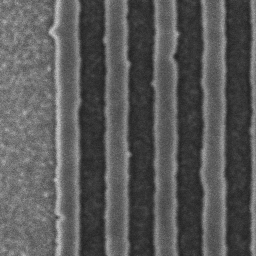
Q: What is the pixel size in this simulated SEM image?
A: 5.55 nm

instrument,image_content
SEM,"parallel lines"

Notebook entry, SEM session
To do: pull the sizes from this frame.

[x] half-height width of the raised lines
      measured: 124 nanometres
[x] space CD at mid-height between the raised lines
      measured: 25.9 px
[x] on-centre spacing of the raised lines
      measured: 48.7 px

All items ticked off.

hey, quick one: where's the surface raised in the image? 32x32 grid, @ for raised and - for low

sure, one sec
-------@@@---@@@---@@@---@@@---@
-------@@@---@@@---@@@---@@@---@
-------@@@---@@@---@@@---@@@---@
-------@@@---@@@---@@@---@@@----
-------@@@---@@@---@@@---@@@----
-------@@@---@@@---@@@---@@@---@
-------@@@---@@@---@@@---@@@---@
-------@@@---@@@---@@@---@@@---@
-------@@@---@@@---@@@---@@@---@
-------@@@---@@@---@@@---@@@---@
-------@@@---@@@---@@@---@@@---@
-------@@@---@@@---@@@---@@@---@
-------@@@---@@@---@@@---@@@----
-------@@@---@@@---@@@---@@@---@
-------@@@---@@@---@@@---@@@---@
-------@@@---@@@---@@@---@@@---@
-------@@@---@@@---@@@---@@@---@
-------@@@---@@@---@@@---@@@---@
-------@@@---@@@---@@@---@@@---@
-------@@@---@@@---@@@---@@@----
-------@@@---@@@---@@@---@@@----
-------@@@---@@@---@@@---@@@----
-------@@@---@@@---@@@---@@@----
-------@@@---@@@---@@@---@@@----
-------@@@---@@@---@@@---@@@----
-------@@@---@@@---@@@----@@---@
-------@@@---@@@---@@@---@@@---@
-------@@@---@@@---@@@---@@@---@
-------@@@---@@@---@@@---@@@---@
-------@@@---@@@---@@@---@@@----
-------@@@---@@@---@@@---@@@---@
-------@@@---@@@---@@@---@@@---@